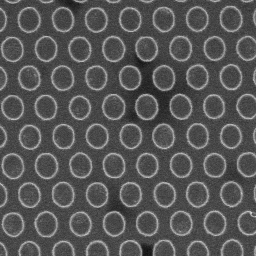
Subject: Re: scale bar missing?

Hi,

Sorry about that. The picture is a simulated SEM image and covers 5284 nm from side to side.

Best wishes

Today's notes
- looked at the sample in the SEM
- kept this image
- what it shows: a regular array of raised bodies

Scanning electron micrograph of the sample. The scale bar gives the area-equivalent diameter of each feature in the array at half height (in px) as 22.6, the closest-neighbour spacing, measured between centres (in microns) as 0.685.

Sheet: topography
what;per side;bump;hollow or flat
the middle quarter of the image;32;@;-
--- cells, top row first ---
--------------------------------
@@----@@@@----@@@@-----@@@@----@
@@----@@@@@---@@@@@---@@@@@----@
@@----@@@@@---@@@@@---@@@@@@---@
@@----@@@@@---@@@@@----@@@@----@
@@----@@@@-----@@@-----@@@@-----
--------------------------------
--------------------------------
---@@------@@@-----@@@-----@@@@-
--@@@@----@@@@@---@@@@@----@@@@-
-@@@@@----@@@@@---@@@@@----@@@@@
--@@@@----@@@@@---@@@@@----@@@@@
--@@@@----@@@@@---@@@@@----@@@@@
---@@------@@@------@@-------@--
--------------------------------
@------@@------@@@------@@------
@@----@@@@@---@@@@@----@@@@----@
@@----@@@@@---@@@@@---@@@@@----@
@@----@@@@@---@@@@@---@@@@@----@
@@----@@@@@----@@@@----@@@@----@
@@-----@@@-----@@@-----@@@@-----
--------------------------------
---@@-------@-------@-------@@--
--@@@@----@@@@@----@@@@----@@@@-
-@@@@@@---@@@@@---@@@@@----@@@@@
--@@@@@---@@@@@---@@@@@----@@@@@
--@@@@@---@@@@@---@@@@@----@@@@@
--@@@@-----@@@@----@@@@-----@@@-
--------------------------------
--------------------------------
@@-----@@@-----@@@-----@@@@----@
@@----@@@@@---@@@@@----@@@@----@